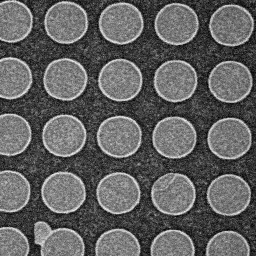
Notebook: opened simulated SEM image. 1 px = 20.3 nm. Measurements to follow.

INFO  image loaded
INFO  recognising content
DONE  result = a regular array of raised bodies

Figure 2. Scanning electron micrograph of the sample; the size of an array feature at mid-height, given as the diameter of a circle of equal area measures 836 nm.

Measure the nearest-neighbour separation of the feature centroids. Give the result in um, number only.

1.11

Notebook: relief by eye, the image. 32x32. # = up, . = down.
###....##......#................
####..#####..####...####...####.
####..#####..#####..#####.#####.
####..#####..#####..#####.######
###...####...####...####...####.
......................#.....##..
................................
##......#.......................
###...####...####...####...####.
####..#####..#####.#####..#####.
####..#####.######.#####..#####.
###...####...####...####...####.
.....................##.....##..
................................
##..............................
###...####...####...####...####.
####.######.######.#####..#####.
####.######.#####..#####..#####.
###...####...####...####..#####.
..............##.....##....###..
................................
#...............................
###...####...####.....##...###..
####.#####..#####....###..#####.
####.######.#####..#####..#####.
###...####...####..#####..#####.
.......#......#......##....###..
................................
#...##..........................
###.######...####...###....###..
###..#####..#####..#####..#####.
###..#####..#####..#####..#####.